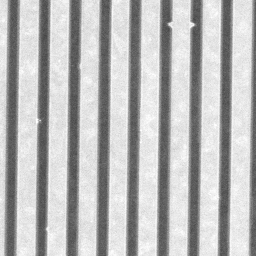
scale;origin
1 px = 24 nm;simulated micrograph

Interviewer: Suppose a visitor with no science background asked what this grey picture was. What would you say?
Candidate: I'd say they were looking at parallel lines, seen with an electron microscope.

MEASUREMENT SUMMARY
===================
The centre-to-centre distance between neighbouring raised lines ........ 731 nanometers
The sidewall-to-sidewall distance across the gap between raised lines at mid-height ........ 11.5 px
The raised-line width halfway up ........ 459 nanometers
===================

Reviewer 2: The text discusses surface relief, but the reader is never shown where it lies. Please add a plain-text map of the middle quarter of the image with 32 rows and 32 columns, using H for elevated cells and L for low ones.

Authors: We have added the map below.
HLLLHHHHHLLLHHHHLLLHHHHHLLLHHHHL
HLLLHHHHHLLLHHHHLLLHHHHHLLLHHHHL
HLLLHHHHHLLLHHHHLLLHHHHHLLLHHHHL
HLLLHHHHHLLLHHHHLLLHHHHHLLLHHHHL
HLLLHHHHHLLLHHHHLLLHHHHHLLLHHHHL
HLLLHHHHLLLLHHHHLLLHHHHHLLLHHHHL
HLLLHHHHLLLLHHHHLLLHHHHHLLLHHHHL
HLLLHHHHLLLLHHHHLLLHHHHHLLLHHHHL
HLLLHHHHLLLLHHHHLLLHHHHHLLLHHHHL
HLLLHHHHLLLLHHHHLLLHHHHHLLLHHHHL
HLLLHHHHLLLLHHHHLLLHHHHHLLLHHHHL
HLLLHHHHLLLLHHHHLLLHHHHHLLLHHHHL
HLLLHHHHLLLLHHHHLLLHHHHHLLLHHHHL
HLLLHHHHLLLHHHHHLLLHHHHHLLLHHHHL
HLLLHHHHLLLHHHHHLLLHHHHHLLLHHHHL
HLLLHHHHLLLHHHHHLLLHHHHHLLLHHHHL
HLLLHHHHLLLHHHHHLLLHHHHHLLLHHHHL
HLLLHHHHLLLHHHHHLLLHHHHHLLLHHHHL
HLLLHHHHLLLHHHHHLLLHHHHHLLLHHHHL
HLLLHHHHLLLHHHHHLLLHHHHHLLLHHHHL
HLLLHHHHLLLHHHHHLLLHHHHHLLLHHHHL
HLLLHHHHLLLHHHHHLLLHHHHHLLLHHHHL
HLLLHHHHLLLHHHHHLLLHHHHHLLLHHHHL
HLLLHHHHLLLHHHHHLLLHHHHHLLLHHHHL
HLLLHHHHLLLHHHHHLLLHHHHHLLLHHHHL
HLLLHHHHLLLHHHHHLLLHHHHHLLLHHHHL
HLLLHHHHLLLHHHHHLLLHHHHLLLLHHHHL
HLLLHHHHLLLHHHHHLLLHHHHLLLLHHHHL
HLLLHHHHLLLHHHHHLLLHHHHLLLLHHHHL
HLLLHHHHLLLHHHHHLLLHHHHLLLLHHHHL
HLLLHHHHLLLHHHHHLLLHHHHLLLLHHHHL
HLLLHHHHLLLHHHHHLLLHHHHLLLLHHHHL